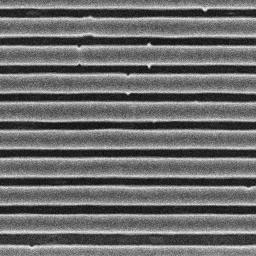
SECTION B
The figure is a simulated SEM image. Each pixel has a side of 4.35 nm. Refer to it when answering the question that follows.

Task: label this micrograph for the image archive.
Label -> parallel lines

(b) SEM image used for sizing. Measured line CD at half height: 81 nm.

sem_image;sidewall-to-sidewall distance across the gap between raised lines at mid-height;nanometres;38.6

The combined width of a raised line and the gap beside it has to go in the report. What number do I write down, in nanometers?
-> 122